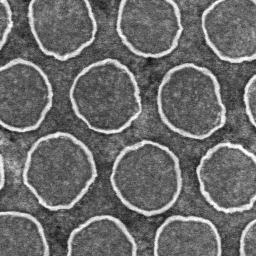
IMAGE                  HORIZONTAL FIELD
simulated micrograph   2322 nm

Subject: raised bodies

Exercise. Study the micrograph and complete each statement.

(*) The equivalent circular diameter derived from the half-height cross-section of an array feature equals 0.622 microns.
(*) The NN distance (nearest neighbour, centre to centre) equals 784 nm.